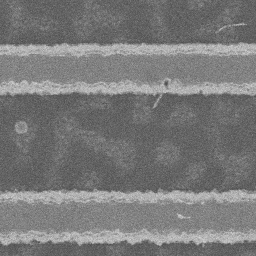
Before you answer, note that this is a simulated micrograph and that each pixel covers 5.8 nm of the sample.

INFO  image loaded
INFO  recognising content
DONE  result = one or a few lines or trenches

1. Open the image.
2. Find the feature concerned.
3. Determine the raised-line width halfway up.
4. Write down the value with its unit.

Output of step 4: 250 nm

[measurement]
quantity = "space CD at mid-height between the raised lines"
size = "611 nm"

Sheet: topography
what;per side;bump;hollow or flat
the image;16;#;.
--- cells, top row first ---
................
................
................
################
################
########.#######
................
................
................
................
................
................
################
################
################
................